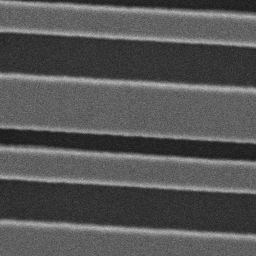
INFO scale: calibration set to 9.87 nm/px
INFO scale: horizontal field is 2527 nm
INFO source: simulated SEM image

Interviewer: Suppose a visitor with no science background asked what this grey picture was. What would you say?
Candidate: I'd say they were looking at lines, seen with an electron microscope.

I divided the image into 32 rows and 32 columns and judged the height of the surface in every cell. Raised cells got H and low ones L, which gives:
HHHHHHHHHLLLLLLLLLLLLLLLLLLLLLLL
HHHHHHHHHHHHHHHHHHHHHHHHHHHHHLLL
HHHHHHHHHHHHHHHHHHHHHHHHHHHHHHHH
HHHHHHHHHHHHHHHHHHHHHHHHHHHHHHHH
LLLLLLLLLLLHHHHHHHHHHHHHHHHHHHHH
LLLLLLLLLLLLLLLLLLLLLLLLLLLLLHHH
LLLLLLLLLLLLLLLLLLLLLLLLLLLLLLLL
LLLLLLLLLLLLLLLLLLLLLLLLLLLLLLLL
LLLLLLLLLLLLLLLLLLLLLLLLLLLLLLLL
HLLLLLLLLLLLLLLLLLLLLLLLLLLLLLLL
HHHHHHHHHHHHHHHHHHHLLLLLLLLLLLLL
HHHHHHHHHHHHHHHHHHHHHHHHHHHHHHHH
HHHHHHHHHHHHHHHHHHHHHHHHHHHHHHHH
HHHHHHHHHHHHHHHHHHHHHHHHHHHHHHHH
HHHHHHHHHHHHHHHHHHHHHHHHHHHHHHHH
HHHHHHHHHHHHHHHHHHHHHHHHHHHHHHHH
LLLLLLLLLLHHHHHHHHHHHHHHHHHHHHHH
LLLLLLLLLLLLLLLLLLLLLLLLLHHHHHHH
HHHHHHLLLLLLLLLLLLLLLLLLLLLLLLLL
HHHHHHHHHHHHHHHHHHHHLLLLLLLLLLLL
HHHHHHHHHHHHHHHHHHHHHHHHHHHHHHHH
HHHHHHHHHHHHHHHHHHHHHHHHHHHHHHHH
LLLLLHHHHHHHHHHHHHHHHHHHHHHHHHHH
LLLLLLLLLLLLLLLLLLLLLHHHHHHHHHHH
LLLLLLLLLLLLLLLLLLLLLLLLLLLLLLLL
LLLLLLLLLLLLLLLLLLLLLLLLLLLLLLLL
LLLLLLLLLLLLLLLLLLLLLLLLLLLLLLLL
LLLLLLLLLLLLLLLLLLLLLLLLLLLLLLLL
HHHHHHHHHHHHLLLLLLLLLLLLLLLLLLLL
HHHHHHHHHHHHHHHHHHHHHHHHHHHHHHLL
HHHHHHHHHHHHHHHHHHHHHHHHHHHHHHHH
HHHHHHHHHHHHHHHHHHHHHHHHHHHHHHHH